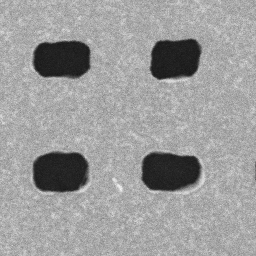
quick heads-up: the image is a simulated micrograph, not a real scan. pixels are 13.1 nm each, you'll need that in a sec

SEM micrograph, holes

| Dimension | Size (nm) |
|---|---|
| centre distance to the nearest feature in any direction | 1450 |